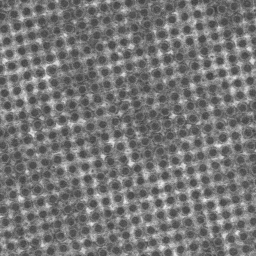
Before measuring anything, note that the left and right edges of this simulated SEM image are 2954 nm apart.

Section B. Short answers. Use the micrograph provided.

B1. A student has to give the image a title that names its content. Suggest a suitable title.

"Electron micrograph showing a regular array of raised bodies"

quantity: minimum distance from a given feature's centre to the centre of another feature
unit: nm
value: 143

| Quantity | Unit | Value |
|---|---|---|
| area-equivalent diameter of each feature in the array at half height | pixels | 9.23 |